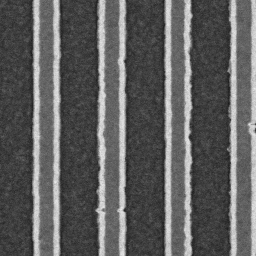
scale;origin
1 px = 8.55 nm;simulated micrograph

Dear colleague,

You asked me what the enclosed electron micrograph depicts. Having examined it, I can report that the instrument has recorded one or a few lines or trenches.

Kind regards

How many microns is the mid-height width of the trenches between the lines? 0.385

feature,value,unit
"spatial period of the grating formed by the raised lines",562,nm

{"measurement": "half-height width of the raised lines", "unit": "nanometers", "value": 181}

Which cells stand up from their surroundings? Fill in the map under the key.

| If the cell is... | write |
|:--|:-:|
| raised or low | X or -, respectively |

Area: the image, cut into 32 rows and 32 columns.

-----XX------XX------XX------XXX
-----XX------XX------XX------XXX
-----XX------XX------XXX-----XXX
-----XX------XX------XX------XXX
-----XX------XX------XX------XXX
-----XX------XX------XX------XXX
-----XX------XX------XX------XXX
-----XX------XX------XX------XXX
-----XX------XX------XX------XXX
-----XX------XX------XX------XXX
-----XX------XX------XX------XXX
-----XX------XX------XX------XXX
-----XX------XX------XXX-----XXX
-----XX------XX------XXX-----XXX
-----XX------XX------XX------XXX
-----XX------XX------XX------XXX
-----XX------XX------XX------XXX
-----XX------XX------XX------XXX
-----XX------XX------XX------XXX
-----XX------XX------XXX-----XXX
-----XX------XX------XXX-----XXX
-----XX------XX------XX------XXX
----XXX------XX------XX------XXX
----XXX------XX------XX------XXX
-----XX------XX------XX------XXX
-----XX------XX------XX------XXX
-----XX-----XXX------XX------XXX
-----XX------XX------XX------XXX
----XXX------XX------XX------XXX
----XXX------XX------XXX-----XXX
-----XX------XX------XXX-----XXX
-----XX------XX------XXX-----XXX